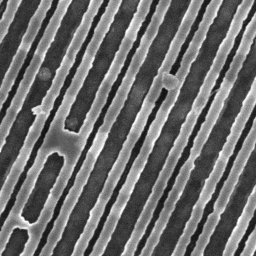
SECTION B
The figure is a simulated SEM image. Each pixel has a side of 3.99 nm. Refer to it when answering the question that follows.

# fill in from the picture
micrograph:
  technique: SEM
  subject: parallel lines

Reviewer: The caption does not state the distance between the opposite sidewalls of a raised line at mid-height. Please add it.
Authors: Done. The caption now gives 0.0424 micrometres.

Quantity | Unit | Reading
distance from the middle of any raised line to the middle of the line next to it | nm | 90.9